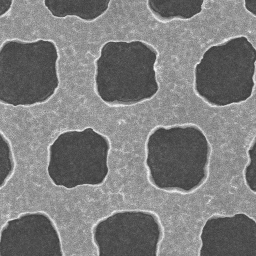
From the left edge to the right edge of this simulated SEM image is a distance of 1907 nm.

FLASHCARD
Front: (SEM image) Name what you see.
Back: holes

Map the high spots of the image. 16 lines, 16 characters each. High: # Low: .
.##....##....##.
################
##############.#
....##....###...
....##....##....
...###....##....
..###########.##
################
####..###....###
.##....##....###
.##....##....##.
####..####..###.
################
#..####...####.#
....##....###...
....##....###...